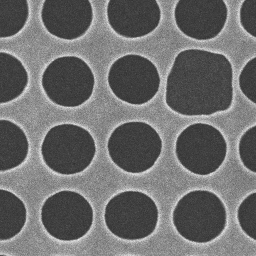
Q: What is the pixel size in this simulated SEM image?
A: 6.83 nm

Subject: a regular array of holes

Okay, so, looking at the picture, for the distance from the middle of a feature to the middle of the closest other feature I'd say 450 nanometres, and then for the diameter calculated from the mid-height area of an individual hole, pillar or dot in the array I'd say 351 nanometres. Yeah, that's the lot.